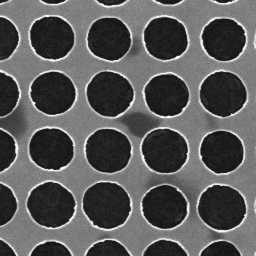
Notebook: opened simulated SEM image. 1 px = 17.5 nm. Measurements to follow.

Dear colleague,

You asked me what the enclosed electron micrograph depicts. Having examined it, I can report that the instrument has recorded a regular array of holes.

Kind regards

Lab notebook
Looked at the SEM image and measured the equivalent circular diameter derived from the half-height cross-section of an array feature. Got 778 nanometers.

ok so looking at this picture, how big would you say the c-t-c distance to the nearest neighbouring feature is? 55.5 pixels